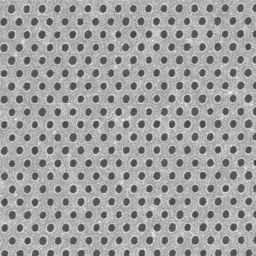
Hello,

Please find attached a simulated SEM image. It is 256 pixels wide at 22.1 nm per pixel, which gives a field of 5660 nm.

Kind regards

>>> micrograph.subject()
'a regular array of holes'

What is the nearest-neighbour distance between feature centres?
326 nm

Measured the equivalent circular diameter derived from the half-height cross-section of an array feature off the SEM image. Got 178 nm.